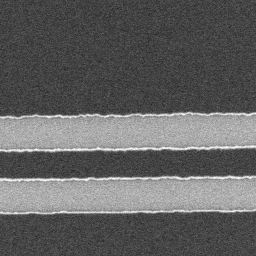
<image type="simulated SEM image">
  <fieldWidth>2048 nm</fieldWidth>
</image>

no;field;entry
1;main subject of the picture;lines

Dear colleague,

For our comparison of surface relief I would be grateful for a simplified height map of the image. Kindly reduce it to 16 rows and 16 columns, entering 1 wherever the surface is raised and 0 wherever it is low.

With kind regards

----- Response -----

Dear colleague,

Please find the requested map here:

1111111111111111
1111111111111111
1111111111111111
1111111111111111
1111111111111111
1111111111111111
1111111111111111
0000000000000000
0000000000000000
1111111111111111
1111111111111111
0000000000000000
0000000000000000
1111111111111111
1111111111111111
1111111111111111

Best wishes